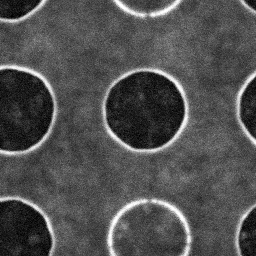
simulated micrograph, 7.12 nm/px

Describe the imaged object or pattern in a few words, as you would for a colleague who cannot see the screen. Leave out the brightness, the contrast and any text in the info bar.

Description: holes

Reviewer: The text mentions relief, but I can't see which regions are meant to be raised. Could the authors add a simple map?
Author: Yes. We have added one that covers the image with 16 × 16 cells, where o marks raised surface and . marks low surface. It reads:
..oooooooooooooo
oooooooooooooooo
oooooooooooooooo
oooooooooooooooo
..ooooooo.oooooo
...oooo....oooo.
...oooo.....ooo.
...oooo....oooo.
...oooo....ooooo
oooooooooooooooo
oooooooooooooooo
oooooooooooooooo
oooooooooooooooo
...oooooooooooo.
...oooooooooooo.
...oooooooooooo.